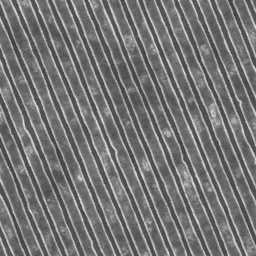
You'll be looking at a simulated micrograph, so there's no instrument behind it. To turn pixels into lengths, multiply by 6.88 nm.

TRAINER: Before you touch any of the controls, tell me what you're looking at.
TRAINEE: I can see parallel lines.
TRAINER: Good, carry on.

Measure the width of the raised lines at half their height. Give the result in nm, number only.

79.7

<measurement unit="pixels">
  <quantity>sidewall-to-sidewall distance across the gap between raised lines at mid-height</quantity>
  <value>4.87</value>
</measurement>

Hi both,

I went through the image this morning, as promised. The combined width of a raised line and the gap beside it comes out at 115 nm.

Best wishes